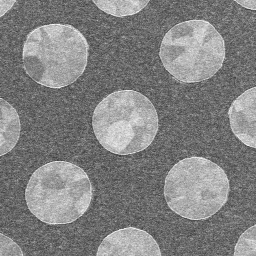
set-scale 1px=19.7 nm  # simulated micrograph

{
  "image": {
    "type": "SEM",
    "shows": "raised bodies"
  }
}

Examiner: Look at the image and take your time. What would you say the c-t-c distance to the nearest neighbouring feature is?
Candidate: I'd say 1910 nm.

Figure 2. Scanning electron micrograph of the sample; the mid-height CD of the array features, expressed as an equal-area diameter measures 1270 nanometres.